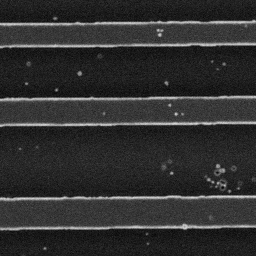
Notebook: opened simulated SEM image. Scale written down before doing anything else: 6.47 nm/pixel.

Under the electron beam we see lines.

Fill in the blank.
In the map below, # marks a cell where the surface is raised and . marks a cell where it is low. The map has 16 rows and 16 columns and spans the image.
................
################
################
................
................
................
################
################
................
................
................
................
################
################
................
................